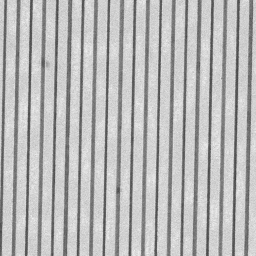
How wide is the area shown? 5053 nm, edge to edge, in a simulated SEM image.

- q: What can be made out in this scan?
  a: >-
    parallel lines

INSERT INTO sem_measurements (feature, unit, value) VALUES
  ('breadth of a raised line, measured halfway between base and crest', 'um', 0.185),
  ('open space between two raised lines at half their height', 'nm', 66.6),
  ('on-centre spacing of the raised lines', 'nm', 255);